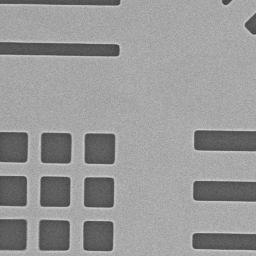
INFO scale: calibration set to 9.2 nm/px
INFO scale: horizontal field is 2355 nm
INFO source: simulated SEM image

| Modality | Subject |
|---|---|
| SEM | groups of lines, slits or small figures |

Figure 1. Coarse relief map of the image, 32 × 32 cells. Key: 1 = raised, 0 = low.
00000000000000011111111111111111
11111111111111111111111111111111
11111111111111111111111111111110
11111111111111111111111111111110
11111111111111111111111111111111
00000000000000111111111111111111
00000000000000011111111111111111
11111111111111111111111111111111
11111111111111111111111111111111
11111111111111111111111111111111
11111111111111111111111111111111
11111111111111111111111111111111
11111111111111111111111111111111
11111111111111111111111111111111
11111111111111111111111111111111
11111111111111111111111111111111
00011100111111111111111100000000
00001000011000111111111100000000
00001000010000111111111100000000
00001000010000111111111111111111
11111110111000111111111111111111
11111111111111111111111111111111
00011000011000111111111111111111
00011000010000111111111100000000
00011000010000111111111100000000
00011000011000111111111111111111
11111111111111111111111111111111
00011000111111111111111111111111
00011000010000111111111111111111
00011000010000111111111100000000
00011000010000111111111100000000
11111111111111111111111111111111